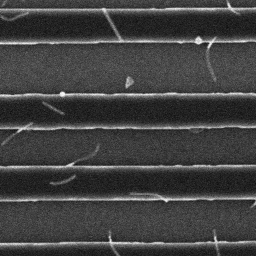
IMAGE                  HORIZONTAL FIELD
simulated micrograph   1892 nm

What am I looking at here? lines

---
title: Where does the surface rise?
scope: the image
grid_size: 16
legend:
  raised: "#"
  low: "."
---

..............#.
################
################
................
................
................
################
################
................
................
################
################
###.......#.....
................
................
################